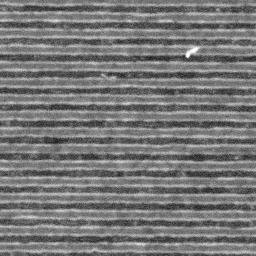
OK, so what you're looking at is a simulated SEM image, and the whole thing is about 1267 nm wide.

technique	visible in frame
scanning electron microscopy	parallel lines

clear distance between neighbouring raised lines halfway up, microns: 0.0409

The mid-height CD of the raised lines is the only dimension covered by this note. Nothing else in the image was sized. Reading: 0.0409 um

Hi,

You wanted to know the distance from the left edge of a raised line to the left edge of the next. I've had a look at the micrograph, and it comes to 81.4 nanometres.